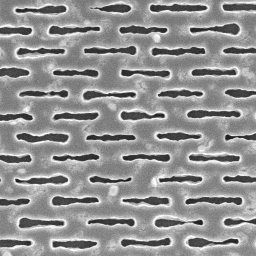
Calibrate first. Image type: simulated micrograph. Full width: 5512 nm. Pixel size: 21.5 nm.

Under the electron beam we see a regular array of holes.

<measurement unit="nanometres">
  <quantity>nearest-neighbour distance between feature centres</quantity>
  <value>801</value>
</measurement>